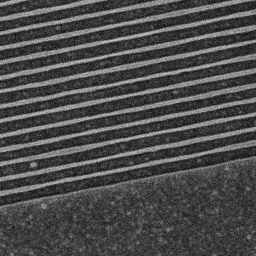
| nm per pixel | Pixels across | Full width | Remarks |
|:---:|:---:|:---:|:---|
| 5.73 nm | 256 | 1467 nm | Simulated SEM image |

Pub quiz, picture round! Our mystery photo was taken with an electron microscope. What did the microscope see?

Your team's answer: parallel lines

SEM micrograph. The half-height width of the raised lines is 21.1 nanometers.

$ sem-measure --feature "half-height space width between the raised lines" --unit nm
58.4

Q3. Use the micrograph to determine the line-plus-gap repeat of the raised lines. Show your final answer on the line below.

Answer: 0.0817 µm